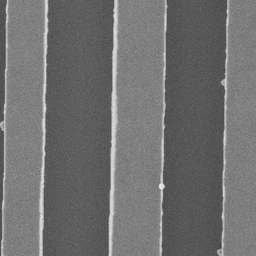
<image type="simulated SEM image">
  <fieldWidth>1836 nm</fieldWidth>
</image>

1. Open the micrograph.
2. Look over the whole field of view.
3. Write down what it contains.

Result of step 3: lines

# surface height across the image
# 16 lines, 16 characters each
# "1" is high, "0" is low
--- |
1110000111000011
1110000111000011
1110000111000011
1110000111000011
1110000111000011
1110000111000011
1110000111000011
1110000111000011
1110000111000011
1110000111000011
1110000111000011
1110000111000011
1110000111000011
1110000111000011
1110000111000011
1110000111000011